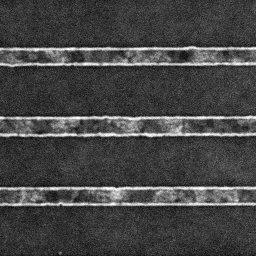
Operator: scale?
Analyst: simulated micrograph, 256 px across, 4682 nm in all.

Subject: one or a few lines or trenches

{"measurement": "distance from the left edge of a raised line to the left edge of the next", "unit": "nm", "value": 1280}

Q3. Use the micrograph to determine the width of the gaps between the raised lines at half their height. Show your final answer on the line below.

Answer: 971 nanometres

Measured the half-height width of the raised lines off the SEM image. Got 0.293 µm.